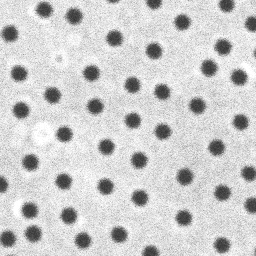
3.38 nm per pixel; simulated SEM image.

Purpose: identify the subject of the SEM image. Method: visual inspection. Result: a regular array of holes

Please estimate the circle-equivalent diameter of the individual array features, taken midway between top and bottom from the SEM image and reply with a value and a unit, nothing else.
57.9 nm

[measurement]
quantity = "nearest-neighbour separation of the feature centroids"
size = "119 nm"